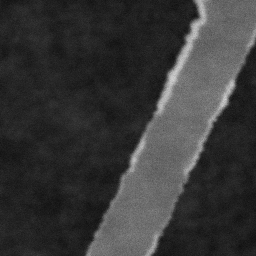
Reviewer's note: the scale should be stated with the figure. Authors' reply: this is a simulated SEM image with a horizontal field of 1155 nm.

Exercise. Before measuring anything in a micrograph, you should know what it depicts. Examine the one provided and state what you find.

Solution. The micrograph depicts one or a few lines or trenches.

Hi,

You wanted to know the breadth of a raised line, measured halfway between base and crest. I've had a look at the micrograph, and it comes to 0.268 micrometres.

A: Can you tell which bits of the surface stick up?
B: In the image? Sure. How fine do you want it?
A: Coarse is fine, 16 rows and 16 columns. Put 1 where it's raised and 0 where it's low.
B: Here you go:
0000000000001111
0000000000001111
0000000000001111
0000000000011110
0000000000011110
0000000000111110
0000000000111100
0000000001111000
0000000001111000
0000000011111000
0000000011110000
0000000011110000
0000000111100000
0000000111100000
0000001111000000
0000001111000000